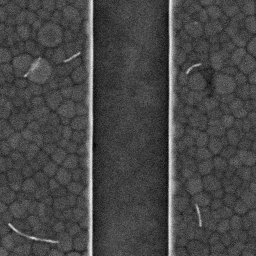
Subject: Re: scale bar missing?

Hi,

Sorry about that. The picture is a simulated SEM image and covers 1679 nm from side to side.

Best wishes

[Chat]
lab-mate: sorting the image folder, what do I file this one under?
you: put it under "wiring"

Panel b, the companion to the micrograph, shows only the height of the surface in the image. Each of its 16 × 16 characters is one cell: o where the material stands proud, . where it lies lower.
oooooo.....ooooo
oooooo.....ooooo
oooooo.....ooooo
oooooo.....ooooo
oooooo.....ooooo
oooooo.....ooooo
oooooo.....ooooo
oooooo.....ooooo
oooooo.....ooooo
oooooo.....ooooo
oooooo.....ooooo
oooooo.....ooooo
oooooo.....ooooo
oooooo.....ooooo
oooooo.....ooooo
oooooo.....ooooo